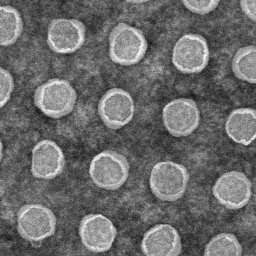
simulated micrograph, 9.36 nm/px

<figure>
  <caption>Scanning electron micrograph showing a regular array of raised bodies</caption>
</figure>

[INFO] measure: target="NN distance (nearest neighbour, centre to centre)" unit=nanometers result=577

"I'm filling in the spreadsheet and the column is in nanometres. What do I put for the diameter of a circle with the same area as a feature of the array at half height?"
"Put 332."